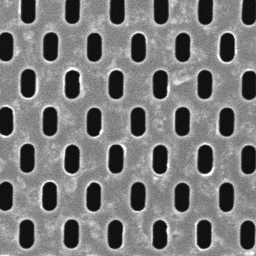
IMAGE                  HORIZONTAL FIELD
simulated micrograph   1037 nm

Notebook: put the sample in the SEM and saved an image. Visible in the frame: a regular array of holes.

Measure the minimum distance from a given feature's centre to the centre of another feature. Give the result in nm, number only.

174